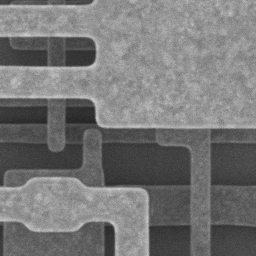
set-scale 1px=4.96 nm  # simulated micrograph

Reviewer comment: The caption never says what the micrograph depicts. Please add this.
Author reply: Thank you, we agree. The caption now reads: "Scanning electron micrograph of wiring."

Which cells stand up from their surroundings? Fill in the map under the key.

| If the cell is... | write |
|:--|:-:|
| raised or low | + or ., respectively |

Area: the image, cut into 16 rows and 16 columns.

++++++++++++++++
++++++++++++++++
......++++++++++
......++++++++++
++++++++++++++++
++++++++++++++++
......++++++++++
......++++++++++
................
................
................
..+++...........
+++++++++.......
+++++++++.......
.......++.......
.......++.......